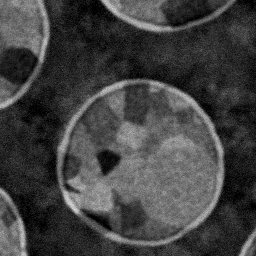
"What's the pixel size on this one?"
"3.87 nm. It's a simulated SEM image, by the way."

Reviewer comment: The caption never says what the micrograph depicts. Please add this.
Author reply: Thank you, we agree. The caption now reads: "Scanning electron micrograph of raised bodies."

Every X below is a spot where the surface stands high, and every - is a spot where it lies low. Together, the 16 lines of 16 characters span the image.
XXX----XXXXXXX--
XXX------XXX----
XXX-------------
XXX-------------
XX--------------
XX-----XXXX-----
-----XXXXXXX----
-----XXXXXXXX---
----XXXXXXXXX---
----XXXXXXXXXX--
----XXXXXXXXXX--
----XXXXXXXXXX--
X---XXXXXXXXX---
X----XXXXXXXX---
X------XXXX-----
XX-------------X